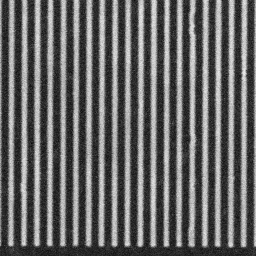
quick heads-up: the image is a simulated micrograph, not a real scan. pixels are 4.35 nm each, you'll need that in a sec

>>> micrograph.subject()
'parallel lines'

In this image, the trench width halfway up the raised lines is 8.74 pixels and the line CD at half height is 17.4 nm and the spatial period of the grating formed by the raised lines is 56.2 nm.